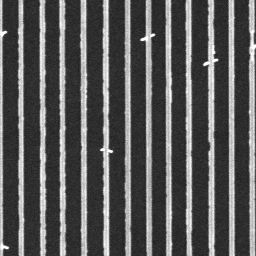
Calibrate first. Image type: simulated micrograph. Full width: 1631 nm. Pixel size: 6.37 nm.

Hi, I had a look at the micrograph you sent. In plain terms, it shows parallel lines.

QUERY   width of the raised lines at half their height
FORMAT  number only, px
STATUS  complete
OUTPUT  3.75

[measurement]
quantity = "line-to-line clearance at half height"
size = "108 nanometers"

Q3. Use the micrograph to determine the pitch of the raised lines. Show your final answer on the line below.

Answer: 134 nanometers